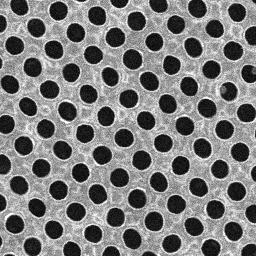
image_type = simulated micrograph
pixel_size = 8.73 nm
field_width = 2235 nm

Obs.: a regular array of holes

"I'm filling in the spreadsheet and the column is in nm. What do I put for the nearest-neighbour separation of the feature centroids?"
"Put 240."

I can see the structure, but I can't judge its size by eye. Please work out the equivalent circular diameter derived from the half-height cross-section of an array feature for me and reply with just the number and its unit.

168 nanometres